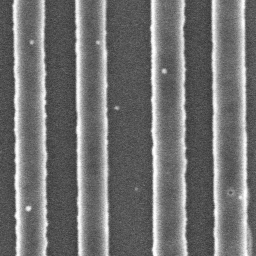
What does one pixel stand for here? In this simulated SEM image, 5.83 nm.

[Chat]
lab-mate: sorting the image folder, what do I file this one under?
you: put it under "lines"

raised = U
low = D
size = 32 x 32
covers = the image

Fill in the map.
DDUUUUDDDDUUUDDDDDDUUUUDDDDUUUDD
DDUUUUDDDDUUUDDDDDDUUUUDDDDUUUDD
DDUUUUDDDDUUUDDDDDDUUUUDDDDUUUDD
DDUUUDDDDDUUUDDDDDDUUUUDDDDUUUDD
DDUUUDDDDDUUUDDDDDDUUUUDDDDUUUDD
DDUUUDDDDDUUUDDDDDDUUUUDDDDUUUDD
DDUUUUDDDDUUUDDDDDDUUUUDDDDUUUDD
DDUUUUDDDDUUUDDDDDDUUUUDDDDUUUDD
DDUUUUDDDDUUUDDDDDDUUUUDDDDUUUUD
DDUUUUDDDDUUUDDDDDDUUUUDDDDUUUUD
DDUUUUDDDDUUUDDDDDDUUUUDDDDUUUUD
DDUUUUDDDDUUUDDDDDDUUUUDDDDUUUUD
DDUUUUDDDDUUUDDDDDDUUUUDDDDUUUUD
DDUUUUDDDDUUUDDDDDDUUUUDDDDUUUUD
DDUUUUDDDDUUUDDDDDDUUUUDDDDUUUUD
DDUUUUDDDDUUUDDDDDDUUUUDDDDUUUUD
DDUUUUDDDDUUUDDDDDDUUUUDDDDUUUUD
DDUUUUDDDDUUUDDDDDDUUUUDDDDUUUUD
DDUUUUDDDDUUUDDDDDDUUUUDDDDUUUUD
DDUUUUDDDDUUUDDDDDDUUUUDDDDUUUUD
DDUUUUDDDDUUUDDDDDDUUUUDDDDUUUUD
DDUUUUDDDDUUUDDDDDDUUUUDDDDUUUUD
DDUUUUDDDDUUUDDDDDDUUUUDDDDUUUUD
DDUUUUDDDDUUUDDDDDDUUUUDDDDUUUUD
DDUUUUDDDDUUUDDDDDDUUUUDDDDUUUUD
DDUUUUDDDDUUUDDDDDDUUUUDDDDUUUUD
DDUUUUDDDDUUUDDDDDDUUUUDDDDUUUUD
DDUUUUDDDDUUUDDDDDDUUUUDDDDUUUUD
DDUUUUDDDDUUUDDDDDDUUUUDDDDUUUUD
DDUUUUDDDDUUUDDDDDDUUUUDDDDUUUUD
DDUUUUDDDDUUUDDDDDDUUUUDDDDUUUUD
DDUUUUDDDDUUUDDDDDDUUUUDDDDUUUUD